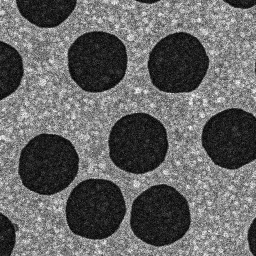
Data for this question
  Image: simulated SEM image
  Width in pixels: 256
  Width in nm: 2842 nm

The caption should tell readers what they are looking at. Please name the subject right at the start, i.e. holes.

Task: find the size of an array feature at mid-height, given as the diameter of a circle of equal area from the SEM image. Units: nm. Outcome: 680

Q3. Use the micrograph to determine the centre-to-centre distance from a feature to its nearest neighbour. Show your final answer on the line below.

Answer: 0.782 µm